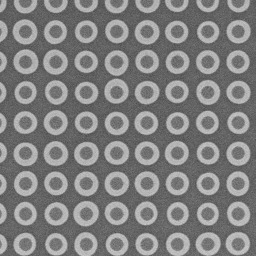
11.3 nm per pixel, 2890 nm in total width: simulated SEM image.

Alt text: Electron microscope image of an array of small figures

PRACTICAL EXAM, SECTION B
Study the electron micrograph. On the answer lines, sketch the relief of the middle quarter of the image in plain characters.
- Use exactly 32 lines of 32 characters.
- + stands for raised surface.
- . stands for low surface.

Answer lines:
+..+++++..++++++..+++++...+++++.
....+++....+++++...++++...++++..
............++..................
................................
...........++++.....++.....+++..
...+++++..++++++..+++++...+++++.
+..+++++..++++++..++++++.++++++.
+..+++++..++++++..++++++.++++++.
+..+++++...+++++..+++++...+++++.
....+++.....++.....+++.....++...
................................
................................
....+++....++++....+++.....+++..
+..+++++...+++++..+++++...+++++.
+..+++++..++++++..+++++...+++++.
+..+++++..++++++..+++++...+++++.
....++++...+++++..+++++...+++++.
............++......++.....++...
................................
............++.............++...
...+++++...+++++..+++++...+++++.
+..++++++.++++++..++++++.++++++.
+..++++++.++++++..++++++.++++++.
+..+++++..++++++..++++++.++++++.
...+++++...++++....++++...++++..
................................
................................
....+++....++++....++++....+++..
...+++++...+++++..+++++...+++++.
+..+++++..++++++..++++++..+++++.
+..+++++..++++++..++++++..+++++.
...+++++...+++++..+++++...+++++.